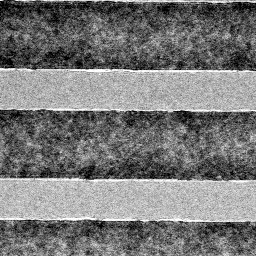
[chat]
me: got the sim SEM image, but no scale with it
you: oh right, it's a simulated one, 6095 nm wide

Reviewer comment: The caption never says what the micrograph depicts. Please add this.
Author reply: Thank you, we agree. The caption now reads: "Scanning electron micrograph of lines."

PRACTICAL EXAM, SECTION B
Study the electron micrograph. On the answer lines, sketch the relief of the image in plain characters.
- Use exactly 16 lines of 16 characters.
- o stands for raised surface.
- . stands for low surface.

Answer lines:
................
................
................
................
ooooooooooooo.o.
oooooooooooooooo
oooooooooooooooo
................
................
................
................
oooooooooooooooo
oooooooooooooooo
oooooooooooooooo
................
................